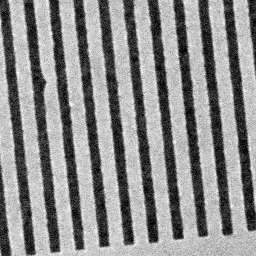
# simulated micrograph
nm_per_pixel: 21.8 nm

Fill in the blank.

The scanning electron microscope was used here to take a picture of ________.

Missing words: parallel lines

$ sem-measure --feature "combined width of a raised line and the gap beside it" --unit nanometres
540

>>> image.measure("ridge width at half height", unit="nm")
260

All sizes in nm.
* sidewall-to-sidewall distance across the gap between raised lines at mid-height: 282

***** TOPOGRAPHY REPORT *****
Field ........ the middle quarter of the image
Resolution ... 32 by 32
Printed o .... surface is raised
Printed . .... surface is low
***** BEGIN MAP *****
o...ooo...ooo...ooo....oo....ooo
o...ooo...ooo...ooo....ooo...ooo
o...ooo...ooo....oo....ooo...ooo
o...ooo...ooo....oo....ooo...ooo
o...ooo....oo....ooo...ooo...ooo
o...ooo....ooo...ooo...ooo...ooo
o...ooo....ooo...ooo...ooo....oo
o....oo....ooo...ooo...ooo....oo
o....ooo...ooo...ooo...ooo....oo
o....ooo...ooo...ooo....oo....oo
oo...ooo...ooo...ooo....ooo...oo
oo...ooo...ooo....oo....ooo...oo
oo...ooo...ooo....oo....ooo...oo
oo...ooo...ooo....ooo...ooo...oo
oo...ooo....ooo...ooo...ooo...oo
oo...ooo...oooo...ooo...ooo...oo
oo....oo....ooo...ooo...ooo...oo
oo....ooo...ooo...ooo...ooo....o
oo....ooo...ooo...ooo....oo....o
oo....ooo...ooo....oo....oo....o
ooo...ooo...ooo...ooo....ooo...o
ooo...ooo...ooo...ooo....ooo...o
ooo...ooo...ooo....oo....ooo...o
ooo...ooo...ooo....ooo...ooo...o
ooo....oo....ooo...ooo...ooo...o
ooo....oo....ooo...ooo...ooo...o
ooo....ooo...ooo...ooo...ooo....
.oo....ooo...ooo...ooo...ooo....
.ooo...ooo...ooo...ooo....oo....
.ooo...ooo...ooo...ooo....oo....
.ooo...ooo...ooo....oo....ooo...
.ooo...ooo...ooo....ooo...ooo...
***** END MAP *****